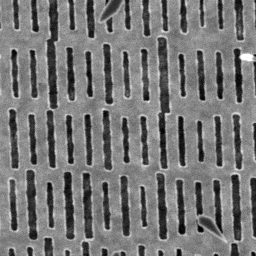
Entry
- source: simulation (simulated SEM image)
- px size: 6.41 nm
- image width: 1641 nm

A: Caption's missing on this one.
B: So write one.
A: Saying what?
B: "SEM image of a regular array of holes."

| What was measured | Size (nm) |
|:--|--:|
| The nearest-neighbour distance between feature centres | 119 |